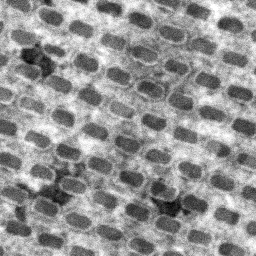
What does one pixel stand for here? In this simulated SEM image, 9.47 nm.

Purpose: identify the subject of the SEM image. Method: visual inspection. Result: a regular array of raised bodies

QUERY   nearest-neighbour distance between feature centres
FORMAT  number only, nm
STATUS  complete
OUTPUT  320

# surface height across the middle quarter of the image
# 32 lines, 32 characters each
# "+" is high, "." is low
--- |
...++++++................++++++.
....+++++..++++..........+++++++
..........+++++++.........+++++.
..........+++++++...............
++..........+++++.++++..........
++............++..++++++........
++..++++..........+++++++.......
+..+++++++.........++++++..++...
...+++++++...........+++..++++++
....++++++..+++...........++++++
.......++..++++++.........++++++
...........+++++++...........+++
++..........++++++..++..........
+++...........+++..++++++.......
+++...++...........+++++++......
+++..+++++..........++++++..++..
....+++++++...........++++.+++++
.....++++++................+++++
.......++++..++++..........+++++
............+++++++..........+++
++...........++++++.............
++++..........+++++..+++........
+++++...........++..+++++++.....
++++..++++..........+++++++.....
..++..++++++.........++++++..+++
......+++++++...........++..++++
......++++++..+++...........++++
.........+++..++++++......+..+++
++...........+++++++......++...+
+++++.........++++++..+++.......
++++++...........+++..+++++.....
++++++..++...........+++++++....